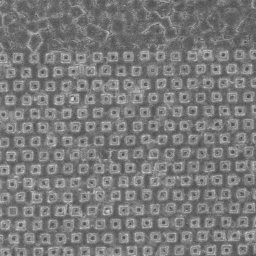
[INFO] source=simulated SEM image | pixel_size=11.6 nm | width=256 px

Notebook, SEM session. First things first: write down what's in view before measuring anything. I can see holes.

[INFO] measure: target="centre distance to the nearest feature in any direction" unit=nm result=180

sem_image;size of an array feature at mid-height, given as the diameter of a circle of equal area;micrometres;0.032